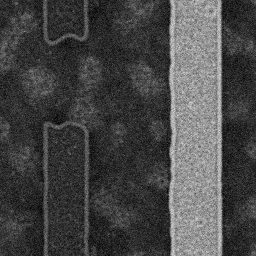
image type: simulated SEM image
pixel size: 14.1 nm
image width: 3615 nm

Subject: one or a few lines or trenches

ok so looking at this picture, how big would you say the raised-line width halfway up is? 0.655 microns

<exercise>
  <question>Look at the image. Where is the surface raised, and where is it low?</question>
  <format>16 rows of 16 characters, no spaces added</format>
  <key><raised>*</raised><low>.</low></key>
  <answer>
...**......***..
...**......***..
...*.......***..
...........***..
...........***..
...........***..
...........***..
...........***..
...**......***..
...**......***..
...**......***..
...**......***..
...**......***..
...**......***..
...**......***..
...**......***..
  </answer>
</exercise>